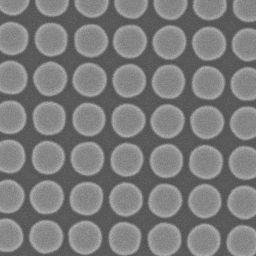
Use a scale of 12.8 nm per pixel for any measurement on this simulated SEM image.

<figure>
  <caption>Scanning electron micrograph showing an array of small figures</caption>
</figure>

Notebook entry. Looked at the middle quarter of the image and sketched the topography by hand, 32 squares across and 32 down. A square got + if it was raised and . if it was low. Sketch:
....++++.......+++.......++.....
...+++++++...++++++....++++++...
...+++++++...+++++++...+++++++..
+.+++++++++.++++++++..++++++++..
+.++++++++..++++++++..++++++++..
...+++++++...+++++++..++++++++..
...+++++++...+++++++...+++++++..
....+++++.....+++++....++++++...
................................
................................
....++++......++++.......++.....
...+++++++...++++++....++++++...
..++++++++..++++++++..++++++++..
..++++++++..++++++++..++++++++..
..++++++++..++++++++..++++++++..
...+++++++..++++++++..++++++++..
...++++++....++++++...+++++++...
....++++......++++.....+++++....
................................
................................
...++++++.....++++......++++....
..+++++++....++++++....++++++...
..++++++++..+++++++...+++++++...
..++++++++..++++++++..+++++++...
..++++++++..++++++++..+++++++...
..++++++++..+++++++...+++++++...
...++++++...+++++++...+++++++...
....+++.......++++.....+++++....
................................
................................
...++++++....+++++.....++++.....
..+++++++...+++++++...++++++....